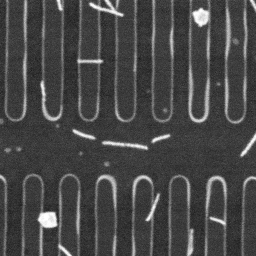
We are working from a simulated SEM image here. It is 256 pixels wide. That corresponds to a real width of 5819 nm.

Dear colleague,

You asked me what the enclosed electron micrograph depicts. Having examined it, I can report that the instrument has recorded groups of lines, slits or small figures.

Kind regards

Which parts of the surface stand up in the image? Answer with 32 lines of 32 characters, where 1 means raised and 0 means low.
01100111001110011001110011001110
01100011001110111001110011001110
01100111001100011001110011000110
01100111001100011001110011000110
01100111001100011001100011000110
01100111001100011001100011001110
01100111001100011001100011001110
01100111001100011001110011001110
01100111001100011001110011001110
01100111001100011001100011001110
01100111001100011001100011001110
01100111001100011001100011001110
01100111001100011001100011001110
01100111001100011001100011001110
01100010001100011001100011001100
00000000000000000000000000000000
00000000000000000000000000000000
00000000000000000000000000000000
00000000000000000000000000000000
00000000000000000000000000000000
00000000000000000000000000000000
00000000000000000000000000000000
00011000110011000110001000110001
10011000110011000110011100110001
10011000110011000110011100110001
10011000110011000110011100110011
10011100110011000110011100110011
10011110110011000110011100110011
10011001110011000110011100110011
10011001110011000110011100110011
10011001110011000110011100110011
10011001110011000110011100110011